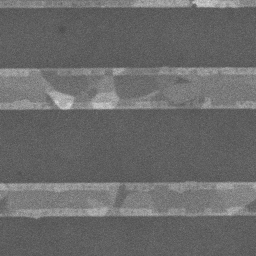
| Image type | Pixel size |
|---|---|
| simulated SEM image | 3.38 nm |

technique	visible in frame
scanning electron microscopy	one or a few lines or trenches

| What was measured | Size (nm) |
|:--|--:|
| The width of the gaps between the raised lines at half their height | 232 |